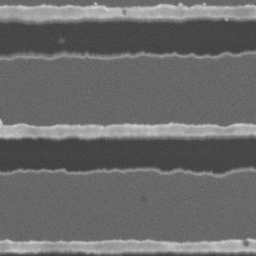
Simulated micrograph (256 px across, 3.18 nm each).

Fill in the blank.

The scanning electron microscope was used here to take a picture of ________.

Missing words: lines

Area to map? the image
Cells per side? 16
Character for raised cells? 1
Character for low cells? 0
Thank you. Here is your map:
1111111111111111
0000000000000000
0000000000000000
0000100011111111
1111111111111111
1111111111111111
1111111111111111
1111111111111111
1111111111111110
0000000000000000
0000000000000000
1111111111111111
1111111111111111
1111111111111111
1111111111111111
1111111111111111